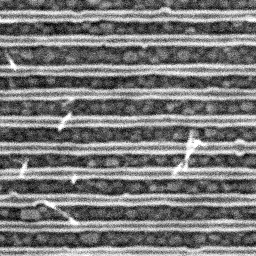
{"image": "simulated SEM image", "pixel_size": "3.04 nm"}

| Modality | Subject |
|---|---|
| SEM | parallel lines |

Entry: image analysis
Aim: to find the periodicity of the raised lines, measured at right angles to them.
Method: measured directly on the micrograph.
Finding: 79.7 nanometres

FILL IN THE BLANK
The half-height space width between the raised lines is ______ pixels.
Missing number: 17.5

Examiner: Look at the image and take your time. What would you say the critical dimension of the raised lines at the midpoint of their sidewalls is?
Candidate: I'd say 25.5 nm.